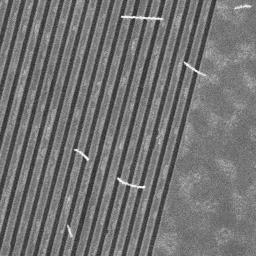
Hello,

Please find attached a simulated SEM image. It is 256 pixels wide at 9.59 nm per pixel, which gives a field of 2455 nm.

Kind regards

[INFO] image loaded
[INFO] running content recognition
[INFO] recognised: parallel lines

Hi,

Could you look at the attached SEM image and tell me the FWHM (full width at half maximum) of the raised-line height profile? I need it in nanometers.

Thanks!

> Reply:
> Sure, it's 60.4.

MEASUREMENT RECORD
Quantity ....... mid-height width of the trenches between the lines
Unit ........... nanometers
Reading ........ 60.4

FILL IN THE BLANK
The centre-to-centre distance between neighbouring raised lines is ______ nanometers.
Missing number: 118